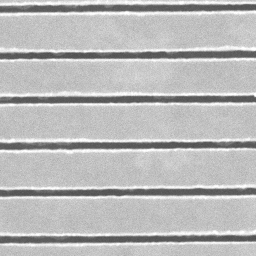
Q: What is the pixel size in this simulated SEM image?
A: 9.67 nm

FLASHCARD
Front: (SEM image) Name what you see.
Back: lines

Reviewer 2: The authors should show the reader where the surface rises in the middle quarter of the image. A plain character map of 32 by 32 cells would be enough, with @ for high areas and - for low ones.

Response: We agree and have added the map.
@@@@@@@@@@@@@@@@@@@@@@@@@@@@@@@@
@@@@@@@@@@@@@@@@@@@@@@@@@@@@@@@@
@@@@@@@@@@@@@@@@@@@@@@@@@@@@@@@@
@@@@@@@@@@@@@@@@@@@@@@@@@@@@@@@@
@@@@@@@@@@@@@@@@@@@@@@@@@@@@@@@@
@@@@@@@@@@@@@@@@@@@@@@@@@@@@@@@@
@@@@@@@@@@@@@@@@@@@@@@@@@@@@@@@@
@@@@@@@@@@@@@@@@@@@@@@@@@@@@@@@@
--------------------------------
--------------------------------
@@@@@@@@@@@@@@@@@@@@@@@@@@@@@@@@
@@@@@@@@@@@@@@@@@@@@@@@@@@@@@@@@
@@@@@@@@@@@@@@@@@@@@@@@@@@@@@@@@
@@@@@@@@@@@@@@@@@@@@@@@@@@@@@@@@
@@@@@@@@@@@@@@@@@@@@@@@@@@@@@@@@
@@@@@@@@@@@@@@@@@@@@@@@@@@@@@@@@
@@@@@@@@@@@@@@@@@@@@@@@@@@@@@@@@
@@@@@@@@@@@@@@@@@@@@@@@@@@@@@@@@
@@@@@@@@@@@@@@@@@@@@@@@@@@@@@@@@
--------------------------------
--------------------------------
@-@@@@@@@@@@@@@@@@@@@@@@@@@@@@@@
@@@@@@@@@@@@@@@@@@@@@@@@@@@@@@@@
@@@@@@@@@@@@@@@@@@@@@@@@@@@@@@@@
@@@@@@@@@@@@@@@@@@@@@@@@@@@@@@@@
@@@@@@@@@@@@@@@@@@@@@@@@@@@@@@@@
@@@@@@@@@@@@@@@@@@@@@@@@@@@@@@@@
@@@@@@@@@@@@@@@@@@@@@@@@@@@@@@@@
@@@@@@@@@@@@@@@@@@@@@@@@@@@@@@@@
@@@@@@@@@@@@@@@@@@@@@@@@@@@@@@@@
@@@@@@@@@@@@@@@@@@@@@@@@@@@@@@@@
--------------------------------